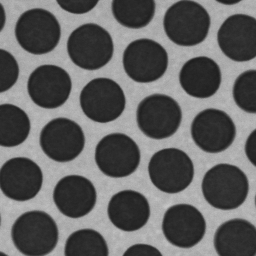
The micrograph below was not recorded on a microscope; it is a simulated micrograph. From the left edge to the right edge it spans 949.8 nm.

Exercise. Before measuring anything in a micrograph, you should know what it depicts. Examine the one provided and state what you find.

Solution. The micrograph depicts a regular array of holes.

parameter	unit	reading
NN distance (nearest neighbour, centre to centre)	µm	0.205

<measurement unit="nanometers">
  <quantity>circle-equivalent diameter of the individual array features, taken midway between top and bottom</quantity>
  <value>163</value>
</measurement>